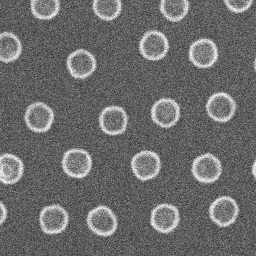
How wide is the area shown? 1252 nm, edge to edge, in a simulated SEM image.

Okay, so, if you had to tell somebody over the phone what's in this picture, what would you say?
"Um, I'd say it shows a regular array of raised bodies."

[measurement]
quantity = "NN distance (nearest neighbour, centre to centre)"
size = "0.258 um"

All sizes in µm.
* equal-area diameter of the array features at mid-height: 0.129